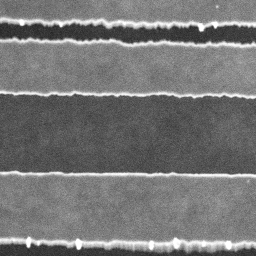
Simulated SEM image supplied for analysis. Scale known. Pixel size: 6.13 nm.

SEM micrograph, lines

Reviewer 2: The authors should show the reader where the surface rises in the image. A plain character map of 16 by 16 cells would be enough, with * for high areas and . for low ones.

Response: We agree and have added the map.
****************
****************
****************
****************
****************
****************
................
................
................
................
................
****************
****************
****************
****************
****************